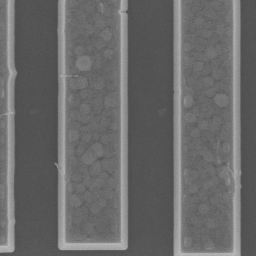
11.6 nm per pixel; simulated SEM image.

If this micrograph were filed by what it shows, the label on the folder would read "one or a few lines or trenches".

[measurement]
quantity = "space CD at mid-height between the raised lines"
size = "0.604 um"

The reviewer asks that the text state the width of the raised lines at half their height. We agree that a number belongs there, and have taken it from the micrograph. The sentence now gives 0.707 microns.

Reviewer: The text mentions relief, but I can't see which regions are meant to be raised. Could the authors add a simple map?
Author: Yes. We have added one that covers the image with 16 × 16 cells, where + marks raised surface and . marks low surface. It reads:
+...++++...++++.
+...++++...++++.
+...++++...++++.
+...++++...++++.
+...++++...++++.
+...++++...++++.
+...++++...++++.
+...++++...++++.
+...++++...++++.
+...++++...++++.
+...++++...++++.
+...++++...++++.
+...++++...++++.
+...++++...++++.
+...++++...++++.
...........++++.